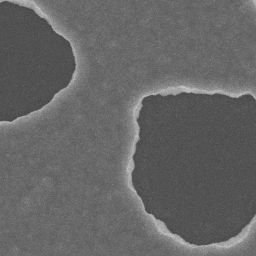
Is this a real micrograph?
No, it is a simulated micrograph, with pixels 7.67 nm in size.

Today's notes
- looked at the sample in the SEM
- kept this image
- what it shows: holes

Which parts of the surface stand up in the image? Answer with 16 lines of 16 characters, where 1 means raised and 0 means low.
0011111111111111
0001111111111111
0000111111111111
0000011111111111
0000011111111111
0000111111111111
0001111110000000
0111111110000000
1111111110000000
1111111100000000
1111111100000000
1111111100000000
1111111110000000
1111111110000000
1111111111100001
1111111111111111